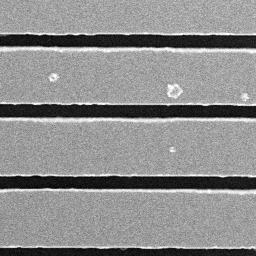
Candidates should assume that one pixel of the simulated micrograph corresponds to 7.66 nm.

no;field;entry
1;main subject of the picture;lines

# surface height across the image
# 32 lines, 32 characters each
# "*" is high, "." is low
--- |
********************************
********************************
********************************
********************************
................................
................................
********************************
********************************
********************************
********************************
********************************
********************************
********************************
................................
................................
********************************
********************************
********************************
********************************
********************************
********************************
********************************
................................
................................
********************************
********************************
********************************
********************************
********************************
********************************
********************************
................................